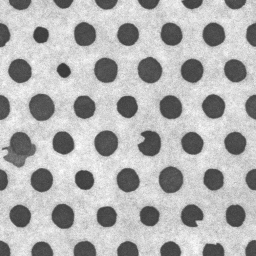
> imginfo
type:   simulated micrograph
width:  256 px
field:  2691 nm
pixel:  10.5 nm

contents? a regular array of holes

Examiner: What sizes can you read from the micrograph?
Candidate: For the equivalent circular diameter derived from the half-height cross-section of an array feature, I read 241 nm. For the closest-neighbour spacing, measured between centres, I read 439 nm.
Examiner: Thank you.